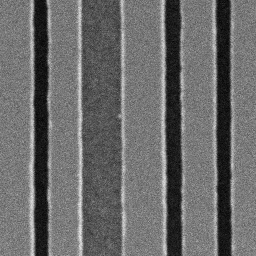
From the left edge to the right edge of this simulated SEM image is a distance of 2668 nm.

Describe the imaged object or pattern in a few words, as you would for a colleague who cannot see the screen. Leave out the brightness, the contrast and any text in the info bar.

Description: lines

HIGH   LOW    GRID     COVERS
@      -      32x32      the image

@@@@--@@@@-----@@@@@@--@@@@--@@@
@@@@--@@@@-----@@@@@@--@@@@--@@@
@@@@--@@@@-----@@@@@@--@@@@--@@@
@@@@--@@@@-----@@@@@@--@@@@--@@@
@@@@--@@@@-----@@@@@@--@@@@--@@@
@@@@--@@@@-----@@@@@@--@@@@--@@@
@@@@--@@@@-----@@@@@@--@@@@--@@@
@@@@--@@@@-----@@@@@@--@@@@--@@@
@@@@--@@@@-----@@@@@@--@@@@--@@@
@@@@--@@@@-----@@@@@@--@@@@--@@@
@@@@--@@@@-----@@@@@@--@@@@--@@@
@@@@--@@@@-----@@@@@@--@@@@--@@@
@@@@--@@@@-----@@@@@@--@@@@--@@@
@@@@--@@@@-----@@@@@@--@@@@--@@@
@@@@--@@@@-----@@@@@@--@@@@--@@@
@@@@--@@@@-----@@@@@@--@@@@--@@@
@@@@--@@@@-----@@@@@@--@@@@--@@@
@@@@--@@@@-----@@@@@@--@@@@--@@@
@@@@--@@@@-----@@@@@@--@@@@--@@@
@@@@--@@@@-----@@@@@@--@@@@--@@@
@@@@--@@@@-----@@@@@@--@@@@--@@@
@@@@--@@@@-----@@@@@@--@@@@--@@@
@@@@--@@@@-----@@@@@@--@@@@--@@@
@@@@--@@@@-----@@@@@@--@@@@--@@@
@@@@--@@@@-----@@@@@@--@@@@--@@@
@@@@--@@@@-----@@@@@@--@@@@--@@@
@@@@--@@@@-----@@@@@@--@@@@--@@@
@@@@--@@@@-----@@@@@@--@@@@--@@@
@@@@--@@@@-----@@@@@@--@@@@--@@@
@@@@--@@@@-----@@@@@@--@@@@--@@@
@@@@--@@@@-----@@@@@@--@@@@--@@@
@@@@--@@@@-----@@@@@@--@@@@--@@@